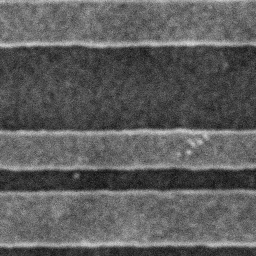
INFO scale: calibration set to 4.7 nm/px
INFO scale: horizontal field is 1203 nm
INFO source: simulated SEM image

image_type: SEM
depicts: lines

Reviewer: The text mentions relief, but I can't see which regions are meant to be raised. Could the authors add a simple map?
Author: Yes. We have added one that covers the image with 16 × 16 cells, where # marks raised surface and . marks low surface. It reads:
################
################
################
................
................
................
................
................
################
################
################
################
################
################
################
................